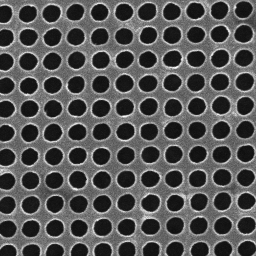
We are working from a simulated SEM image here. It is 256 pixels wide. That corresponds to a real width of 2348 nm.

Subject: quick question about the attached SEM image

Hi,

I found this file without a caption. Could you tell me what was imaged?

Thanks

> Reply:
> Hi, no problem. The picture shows a regular array of holes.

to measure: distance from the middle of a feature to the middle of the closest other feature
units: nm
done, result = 215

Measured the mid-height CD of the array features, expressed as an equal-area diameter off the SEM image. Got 160 nm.